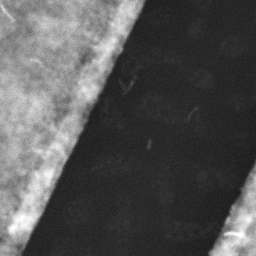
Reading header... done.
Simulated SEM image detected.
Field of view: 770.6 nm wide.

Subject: one or a few lines or trenches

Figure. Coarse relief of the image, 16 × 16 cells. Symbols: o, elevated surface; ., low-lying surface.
oooooooo........
ooooooo.........
ooooooo.........
oooooo..........
oooooo..........
ooooo...........
ooooo...........
oooo............
oooo............
ooo.............
ooo.............
ooo.............
oo..............
oo.............o
o..............o
o.............oo